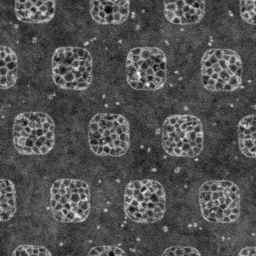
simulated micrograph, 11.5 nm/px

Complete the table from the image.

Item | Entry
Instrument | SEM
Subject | a regular array of raised bodies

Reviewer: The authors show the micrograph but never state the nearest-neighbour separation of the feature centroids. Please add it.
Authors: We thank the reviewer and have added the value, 850 nm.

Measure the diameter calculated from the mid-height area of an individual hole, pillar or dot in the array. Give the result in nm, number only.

464